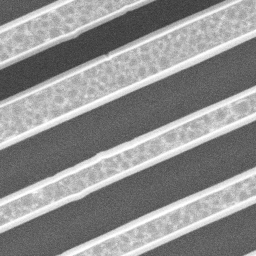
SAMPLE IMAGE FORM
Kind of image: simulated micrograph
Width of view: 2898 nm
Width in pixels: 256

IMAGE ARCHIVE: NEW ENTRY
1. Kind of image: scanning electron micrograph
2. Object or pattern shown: one or a few lines or trenches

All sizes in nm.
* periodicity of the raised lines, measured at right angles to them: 893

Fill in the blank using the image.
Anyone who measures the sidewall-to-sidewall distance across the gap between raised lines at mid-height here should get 565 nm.